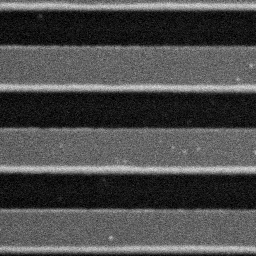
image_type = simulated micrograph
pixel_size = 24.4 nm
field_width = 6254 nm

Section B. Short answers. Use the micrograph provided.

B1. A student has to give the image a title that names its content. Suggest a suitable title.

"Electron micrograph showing lines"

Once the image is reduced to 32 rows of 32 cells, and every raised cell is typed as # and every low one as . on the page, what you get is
################################
................................
................................
................................
................................
................................
################################
################################
################################
################################
################################
................................
................................
................................
................................
................................
################################
################################
################################
################################
################################
................................
................................
................................
................................
................................
################################
################################
################################
################################
################################
................................